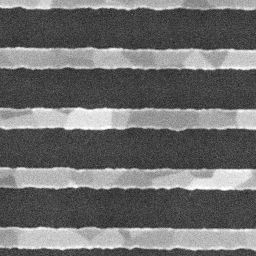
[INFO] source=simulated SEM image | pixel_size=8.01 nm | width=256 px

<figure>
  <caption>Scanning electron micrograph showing lines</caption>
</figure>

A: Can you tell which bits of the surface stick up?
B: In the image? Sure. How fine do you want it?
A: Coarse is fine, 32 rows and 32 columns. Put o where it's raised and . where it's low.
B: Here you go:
oooooooooooooooooooooooooooooooo
................................
................................
................................
................................
................................
oooooooooooooooooooooooooooooooo
oooooooooooooooooooooooooooooooo
oo.ooooo.ooo.oo.oooooooooooooooo
................................
................................
................................
................................
................................
oooooooooooooooooooooooooooooooo
oooooooooooooooooooooooooooooooo
................................
................................
................................
................................
................................
oooooooooooooooooooooooooooooooo
oooooooooooooooooooooooooooooooo
.......o....oo.o.o.ooo.ooooooooo
................................
................................
................................
................................
ooo.oo....oo....................
oooooooooooooooooooooooooooooooo
oooooooooooooooooooooooooooooooo
................................